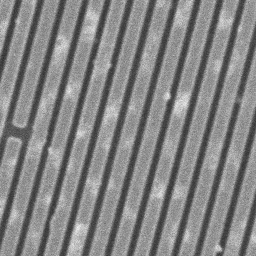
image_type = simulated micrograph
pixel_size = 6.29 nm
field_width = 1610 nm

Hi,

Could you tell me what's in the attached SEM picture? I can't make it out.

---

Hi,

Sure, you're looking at parallel lines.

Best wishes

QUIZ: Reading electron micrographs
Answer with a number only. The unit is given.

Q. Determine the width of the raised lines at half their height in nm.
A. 86.6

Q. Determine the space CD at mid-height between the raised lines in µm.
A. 0.0487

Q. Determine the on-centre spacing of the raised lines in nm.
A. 136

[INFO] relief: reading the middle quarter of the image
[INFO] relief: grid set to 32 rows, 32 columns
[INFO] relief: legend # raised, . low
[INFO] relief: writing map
..####..####.####..####..###..##
..###..####..###...###..####..##
..###..####..###...###..####..##
.####..###..####..####..###..###
.####..###..####..###...###..###
.###..####..###...###..####..###
.###..####..###..####..###...###
####..###..####..####..###..####
####..###..####..###..####..####
###..####..###...###..####..###.
###..####..###..####..###..####.
###..###..####..####..###..####.
##...###..####..###..####..###..
##..####..###...###..####..###..
##..###...###..####..###..####..
##..###..####..####..###..####..
#..####..####..###..####..###..#
#..####..###...###..####..###..#
#..###..####..####..###..####..#
#..###..####..###...###..####..#
..####..###...###..####..###..##
..####..###..####..####..###..##
..###..####..####..###..####..##
..###..####..###..####..####..##
.####..###...###..####..###..###
.####..###..####..###...###..###
.###..####..####..###..####..###
.###..####..###..####..###...###
####..###...###..####..###..####
####..###..####..###..####..####
###..####..####..###..####..###.
###..####..###..####..###..####.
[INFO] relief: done